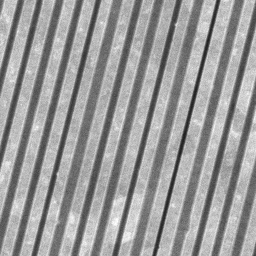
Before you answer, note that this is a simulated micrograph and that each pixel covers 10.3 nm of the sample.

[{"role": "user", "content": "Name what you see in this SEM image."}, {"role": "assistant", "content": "parallel lines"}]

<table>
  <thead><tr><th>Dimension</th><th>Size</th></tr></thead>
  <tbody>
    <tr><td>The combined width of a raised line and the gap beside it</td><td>200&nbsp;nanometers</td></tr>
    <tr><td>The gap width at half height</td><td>75.2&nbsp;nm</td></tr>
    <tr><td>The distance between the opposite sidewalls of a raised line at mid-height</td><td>122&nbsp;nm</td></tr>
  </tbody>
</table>